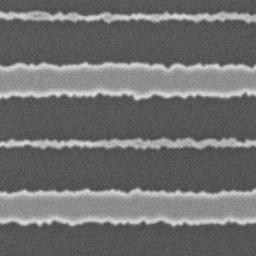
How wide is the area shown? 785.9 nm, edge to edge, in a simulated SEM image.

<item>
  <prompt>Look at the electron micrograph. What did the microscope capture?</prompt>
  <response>lines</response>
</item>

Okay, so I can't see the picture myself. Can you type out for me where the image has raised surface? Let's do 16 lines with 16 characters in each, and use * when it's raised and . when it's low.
................
................
................
................
****************
****************
................
................
................
................
................
................
****************
****************
................
................